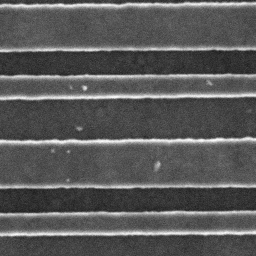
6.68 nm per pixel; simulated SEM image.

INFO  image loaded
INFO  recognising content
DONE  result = lines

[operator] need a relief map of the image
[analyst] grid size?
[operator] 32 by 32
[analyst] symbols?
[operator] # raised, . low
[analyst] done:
...................#...#########
################################
################################
################################
################################
################################
................................
................................
................................
..........######################
################################
################################
................................
................................
................................
................................
................................
...........................##.##
################################
################################
################################
################################
################################
................................
................................
................................
................................
################################
################################
................................
................................
................................